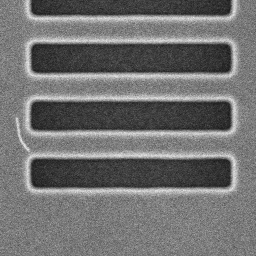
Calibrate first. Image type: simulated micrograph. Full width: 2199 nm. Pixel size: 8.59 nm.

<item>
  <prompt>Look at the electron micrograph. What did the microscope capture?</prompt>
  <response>groups of lines, slits or small figures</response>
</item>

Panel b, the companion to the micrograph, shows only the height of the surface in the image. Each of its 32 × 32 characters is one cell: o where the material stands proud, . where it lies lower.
oooo.........................ooo
oooo.........................ooo
oooooooooooooooooooooooooooooooo
oooooooooooooooooooooooooooooooo
oooooooooooooooooooooooooooooooo
oooo.........................ooo
oooo.........................ooo
oooo.........................ooo
oooo.........................ooo
oooooooooooooooooooooooooooooooo
oooooooooooooooooooooooooooooooo
oooooooooooooooooooooooooooooooo
ooooo.......................oooo
oooo.........................ooo
oooo.........................ooo
oooo.........................ooo
ooooo...ooooooo..........ooooooo
oooooooooooooooooooooooooooooooo
oooooooooooooooooooooooooooooooo
oooooooooooooooooooooooooooooooo
oooo.........................ooo
oooo.........................ooo
oooo.........................ooo
oooo........................oooo
oooooooooooooooooooooooooooooooo
oooooooooooooooooooooooooooooooo
oooooooooooooooooooooooooooooooo
oooooooooooooooooooooooooooooooo
oooooooooooooooooooooooooooooooo
oooooooooooooooooooooooooooooooo
oooooooooooooooooooooooooooooooo
oooooooooooooooooooooooooooooooo